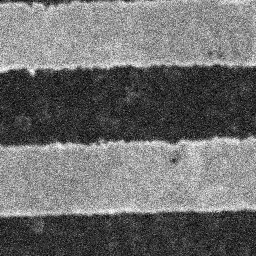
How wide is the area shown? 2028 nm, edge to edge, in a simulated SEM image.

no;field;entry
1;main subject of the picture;one or a few lines or trenches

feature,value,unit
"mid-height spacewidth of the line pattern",0.603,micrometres